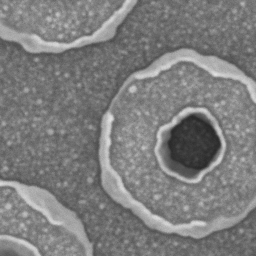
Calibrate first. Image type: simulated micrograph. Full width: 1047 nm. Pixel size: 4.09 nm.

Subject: ring-shaped raised bodies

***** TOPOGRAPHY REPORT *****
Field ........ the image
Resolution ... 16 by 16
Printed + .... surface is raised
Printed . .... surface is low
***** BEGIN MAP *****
++++++++........
+++++++.........
.+++++..........
..........++....
.........++++++.
........++++++++
.......+++++++++
.......++++..+++
......+++++...++
......++++....++
......+++++..+++
+......+++++++++
+++.....++++++++
++++.....++++++.
+++++......++...
++++++..........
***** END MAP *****